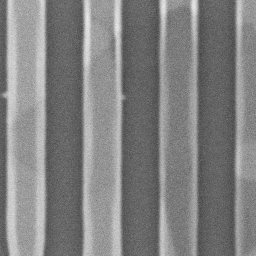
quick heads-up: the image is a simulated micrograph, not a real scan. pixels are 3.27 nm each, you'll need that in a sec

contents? wiring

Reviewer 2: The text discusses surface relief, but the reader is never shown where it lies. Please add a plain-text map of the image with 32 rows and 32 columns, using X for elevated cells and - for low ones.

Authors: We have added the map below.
-XXXXX-----XXXX-----XXXXX-----XX
-XXXXX-----XXXX-----XXXXX-----XX
-XXXXX-----XXXX-----XXXXX-----XX
-XXXXX-----XXXX-----XXXXX-----XX
-XXXXX-----XXXX-----XXXXX-----XX
-XXXXX-----XXXX-----XXXXX-----XX
-XXXXX-----XXXX-----XXXXX-----XX
-XXXXX-----XXXX-----XXXXX-----XX
-XXXXX-----XXXX-----XXXXX-----XX
-XXXXX-----XXXX-----XXXXX-----XX
-XXXXX-----XXXX-----XXXXX-----XX
-XXXXX-----XXXX-----XXXXX-----XX
-XXXXX-----XXXX-----XXXXX-----XX
-XXXXX-----XXXX-----XXXXX-----XX
-XXXXX-----XXXX-----XXXXX-----XX
-XXXXX-----XXXX-----XXXXX-----XX
-XXXXX-----XXXX-----XXXXX-----XX
-XXXXX-----XXXX-----XXXXX-----XX
-XXXXX-----XXXX-----XXXXX-----XX
-XXXXX-----XXXX-----XXXXX-----XX
-XXXXX-----XXXX-----XXXXX-----XX
-XXXXX-----XXXX-----XXXXX-----XX
-XXXXX-----XXXX-----XXXXX-----XX
-XXXXX----XXXXX-----XXXXX-----XX
-XXXXX----XXXXX-----XXXXX-----XX
-XXXXX----XXXXX-----XXXXX----XXX
-XXXXX----XXXXX-----XXXXX----XXX
-XXXXX-----XXXX-----XXXXX----XXX
-XXXXX-----XXXX-----XXXXX----XXX
-XXXXX-----XXXX-----XXXXX----XXX
-XXXXX-----XXXX-----XXXXX-----XX
-XXXX-----XXXXX-----XXXXX-----XX